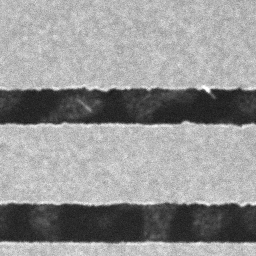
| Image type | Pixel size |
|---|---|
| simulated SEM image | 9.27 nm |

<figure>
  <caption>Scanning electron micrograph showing one or a few lines or trenches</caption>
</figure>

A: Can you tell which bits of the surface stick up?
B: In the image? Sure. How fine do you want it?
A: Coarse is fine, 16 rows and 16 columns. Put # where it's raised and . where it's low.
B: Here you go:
################
################
################
################
################
#####.##..######
................
................
################
################
################
################
################
................
................
################